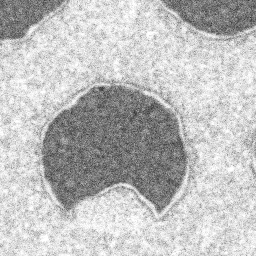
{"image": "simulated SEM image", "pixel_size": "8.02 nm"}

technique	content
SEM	raised bodies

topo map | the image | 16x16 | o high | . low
oooo......oooooo
oo..........oooo
o...............
................
................
......oo........
....oooooo......
...oooooooo.....
...oooooooo.....
...ooooooooo....
...ooooooooo....
...ooooooooo....
...oo....oo.....
................
................
................